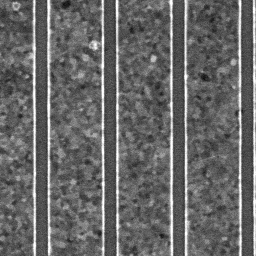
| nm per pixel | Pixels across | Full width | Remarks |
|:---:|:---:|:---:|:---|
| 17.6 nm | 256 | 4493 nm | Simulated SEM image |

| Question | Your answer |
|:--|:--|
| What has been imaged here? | wiring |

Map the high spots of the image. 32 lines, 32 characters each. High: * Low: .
****..*******..******..*******..
****..*******..******..*******..
****..*******..******..*******..
****..*******..******..*******..
****..*******..******..*******..
****..*******..******..*******..
****..*******..******..*******..
****..*******..******..*******..
****..*******..******..*******..
****..*******..******..*******..
****..*******..******..*******..
****..*******..******..*******..
****..*******..******..*******..
****..*******..******..*******..
****..*******..******..*******..
****..*******..******..*******..
****..*******..******..*******..
****..*******..******..*******..
****..*******..******..*******..
****..*******..******..*******..
****..*******..******..*******..
****..*******..******..*******..
****..*******..******..*******..
****..*******..******..*******..
****..*******..******..*******..
****..*******..******..*******..
****..*******..******..*******..
****..*******..******..*******..
****..*******..******..*******..
****..*******..******..*******..
****..*******..******..*******..
****..*******..******..*******..